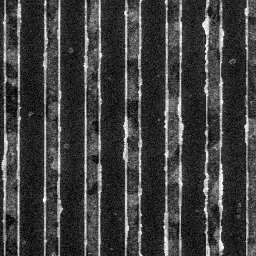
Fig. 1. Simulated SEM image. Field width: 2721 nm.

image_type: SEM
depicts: parallel lines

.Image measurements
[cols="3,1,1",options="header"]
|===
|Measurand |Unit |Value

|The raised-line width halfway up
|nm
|161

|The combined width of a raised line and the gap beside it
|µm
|0.429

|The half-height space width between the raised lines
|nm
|270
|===